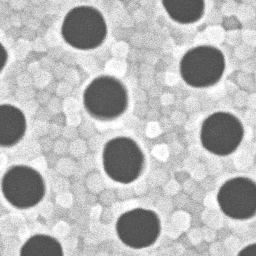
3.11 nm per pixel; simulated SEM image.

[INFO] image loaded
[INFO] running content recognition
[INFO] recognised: holes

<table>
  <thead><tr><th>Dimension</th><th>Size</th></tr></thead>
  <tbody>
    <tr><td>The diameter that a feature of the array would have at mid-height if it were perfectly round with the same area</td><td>139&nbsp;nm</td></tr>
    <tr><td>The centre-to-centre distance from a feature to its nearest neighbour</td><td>69.7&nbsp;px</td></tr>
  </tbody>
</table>